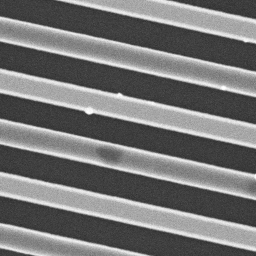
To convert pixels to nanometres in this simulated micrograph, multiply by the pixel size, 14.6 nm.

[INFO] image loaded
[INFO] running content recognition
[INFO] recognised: lines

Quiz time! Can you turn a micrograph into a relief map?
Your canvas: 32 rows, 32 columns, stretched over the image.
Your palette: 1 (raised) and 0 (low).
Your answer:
00000000001111111111111000000000
00000000000000111111111111100000
11000000000000000001111111111111
11111110000000000000000111111111
11111111111000000000000000001111
00111111111111110000000000000000
00000011111111111111100000000000
00000000000111111111111110000000
00000000000000001111111111111100
11110000000000000000111111111111
11111111000000000000000011111111
11111111111110000000000000000111
00001111111111111100000000000000
00000000011111111111110000000000
00000000000000111111111111100000
11100000000000000011111111111111
11111111000000000000000111111111
11111111111100000000000000011111
00111111111111110000000000000000
00000001111111111111100000000000
00000000000011111111111111000000
00000000000000001111111111111100
11110000000000000000011111111111
11111111100000000000000001111111
01111111111111000000000000000011
00000111111111111100000000000000
00000000011111111111111000000000
00000000000000111111111111100000
11100000000000000001111111111111
11111110000000000000000111111111
11111111111100000000000000001111
00111111111111111000000000000000